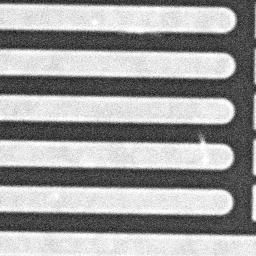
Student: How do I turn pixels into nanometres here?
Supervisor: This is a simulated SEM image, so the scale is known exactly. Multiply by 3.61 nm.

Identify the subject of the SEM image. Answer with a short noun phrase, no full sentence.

groups of lines, slits or small figures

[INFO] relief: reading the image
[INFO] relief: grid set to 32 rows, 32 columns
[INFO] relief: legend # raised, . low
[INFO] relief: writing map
................................
#############################...
#############################...
..###########################...
................................
................................
###############.................
#############################...
#############################...
.....................#######....
................................
................................
############################....
#############################...
#############################...
................................
................................
................................
#############################...
#############################...
#############################...
................................
................................
#...............................
#############################...
#############################...
.........###################....
................................
................................
######################..........
################################
################################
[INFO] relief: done